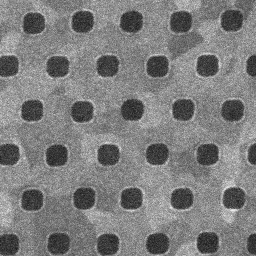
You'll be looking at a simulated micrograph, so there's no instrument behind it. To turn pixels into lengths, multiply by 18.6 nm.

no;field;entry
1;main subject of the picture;a regular array of holes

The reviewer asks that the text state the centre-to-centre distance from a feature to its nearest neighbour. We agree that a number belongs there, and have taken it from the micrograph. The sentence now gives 927 nanometers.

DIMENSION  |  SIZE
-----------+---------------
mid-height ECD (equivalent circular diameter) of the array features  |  453 nm